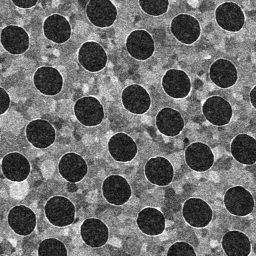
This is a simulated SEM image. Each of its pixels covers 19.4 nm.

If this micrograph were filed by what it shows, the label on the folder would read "a regular array of holes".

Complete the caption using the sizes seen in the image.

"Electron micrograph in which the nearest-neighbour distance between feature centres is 830 nanometres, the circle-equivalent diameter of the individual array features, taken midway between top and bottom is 578 nm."